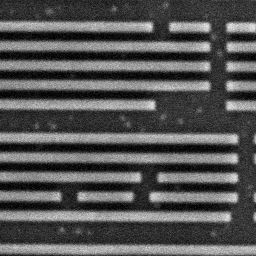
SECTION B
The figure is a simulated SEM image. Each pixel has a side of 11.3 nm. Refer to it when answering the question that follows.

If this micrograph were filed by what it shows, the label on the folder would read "groups of lines, slits or small figures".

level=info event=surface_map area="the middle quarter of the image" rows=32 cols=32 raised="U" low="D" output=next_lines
UUUUUUUUUUUUUUUUUUUUUUUUUUUUUUUU
DDDDDDDDDDDDDDDDDDDDDDDDDDDDDDDD
DDDDDDDDDDDDDDDDDDDDDDDDDDDDDDDD
DDDDDDDDDDDDDDDDDDDDDDDDDDDDDDDD
UUUUUUUUUUUUUUUUUUUUUUUUUUUUUUUU
UUUUUUUUUUUUUUUUUUUUUUUUUUUUUUUU
DDDDDDDDDDDDDDDDDDDDDDDDDDDDDDDD
DDDDDDDDDDDDDDDDDDDDDDDDDDDDDDDD
DDDDDDDDDDDDDDDDDDDDDDDDDDDDDDDD
UUUUUUUUUUUUUUUUUUUUUUUDDDDDDDDD
UUUUUUUUUUUUUUUUUUUUUUUDDDDDDDDD
DDDDDDDDDDDDDDDDDDDDDDDDDDDDDDDD
DDDDDDDDDDDDDDDDDDDDDDDDDDDDDDDD
DDDDDDDDDDDDDDDDDDDDDDDDDDDDDDDD
DDDDDDDDDDDDDDDDDDDDDDDDDDDDDDDD
DDDDDDDDDDDDDDDDDDDDDDDDDDDDDDDD
DDDDDDDDDDDDDDDDDDDDDDDDDDDDDDDD
UUUUUUUUUUUUUDDDDDDDDDDDDDDDDDDD
UUUUUUUUUUUUUUUUUUUUUUUUUUUUUUUU
UUUUUUUUUUUUUUUUUUUUUUUUUUUUUUUU
DDDDDDDDDDDDDDDDDDDDDDDDDDDDDDDD
DDDDDDDDDDDDDDDDDDDDDDDDDDDDDDDD
UUUUUUUUUUUUUUUUUUUUUUUUUUUUUDDD
UUUUUUUUUUUUUUUUUUUUUUUUUUUUUUUU
DDDDDDDDDDDDDDDDDDDDDDDDDDDDDDDD
DDDDDDDDDDDDDDDDDDDDDDDDDDDDDDDD
DDDDDDDDDDDDDDDDDDDDDDDDDDDDDDDD
UUUUUUUUUUUUUUUUUUUDDDDDUUUUUUUU
UUUUUUUUUUUUUUUUUUUDDDDDUUUUUUUU
DDDDDDDDDDDDDDDDDDDDDDDDDDDDDDDD
DDDDDDDDDDDDDDDDDDDDDDDDDDDDDDDD
DDDDDDDDDDDDDDDDDDDDDDDDDDDDDDDD